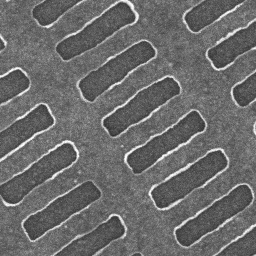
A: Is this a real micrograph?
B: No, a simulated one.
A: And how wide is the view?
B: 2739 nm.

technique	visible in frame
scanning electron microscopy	holes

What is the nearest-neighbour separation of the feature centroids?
0.468 µm